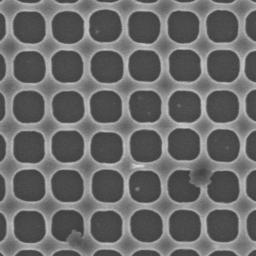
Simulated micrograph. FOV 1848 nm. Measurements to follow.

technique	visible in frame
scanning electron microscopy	a regular array of holes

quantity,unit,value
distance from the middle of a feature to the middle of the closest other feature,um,0.275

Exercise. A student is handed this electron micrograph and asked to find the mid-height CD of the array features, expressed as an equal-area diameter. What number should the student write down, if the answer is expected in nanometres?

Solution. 248